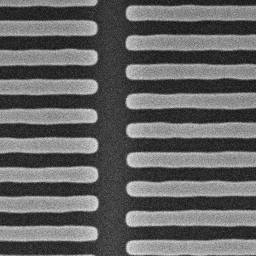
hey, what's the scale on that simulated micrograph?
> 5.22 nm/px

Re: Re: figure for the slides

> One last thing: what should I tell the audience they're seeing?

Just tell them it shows groups of lines, slits or small figures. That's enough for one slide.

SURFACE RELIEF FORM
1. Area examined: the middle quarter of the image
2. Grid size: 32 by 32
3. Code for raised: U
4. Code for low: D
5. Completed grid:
DDDDDDDDDDDDDDDDUUUUUUUUUUUUUUUU
DDDDDDDDDDDDDDDDUUUUUUUUUUUUUUUU
DDDDDDDDDDDDDDDDUUUUUUUUUUUUUUUU
DDDDDDDDDDDDDDDDUUUUUUUUUUUUUUUU
UUUUUUUUDDDDDDDDDDDDDDDDDDDDDDDD
UUUUUUUUDDDDDDDDDDDDDDDDDDDDDDDD
UUUUUUUUDDDDDDDDDDDDDDDDDDDDDDDD
DDDDDDDDDDDDDDDDDDDDDDDDDDDDDDDD
DDDDDDDDDDDDDDDDUUUUUUUUUUUUUUUU
DDDDDDDDDDDDDDDDUUUUUUUUUUUUUUUU
DDDDDDDDDDDDDDDDUUUUUUUUUUUUUUUU
UUUUUUUDDDDDDDDDDDDDDDDDDDDDDDDD
UUUUUUUUDDDDDDDDDDDDDDDDDDDDDDDD
UUUUUUUUDDDDDDDDDDDDDDDDDDDDDDDD
UUUUUUUUDDDDDDDDDDDDDDDDDDDDDDDD
DDDDDDDDDDDDDDDDUUUUUUUUUUUUUUUU
DDDDDDDDDDDDDDDDUUUUUUUUUUUUUUUU
DDDDDDDDDDDDDDDDUUUUUUUUUUUUUUUU
DDDDDDDDDDDDDDDDDDDDDDDDDDDDDDDD
UUUUUUUUDDDDDDDDDDDDDDDDDDDDDDDD
UUUUUUUUDDDDDDDDDDDDDDDDDDDDDDDD
UUUUUUUUDDDDDDDDDDDDDDDDDDDDDDDD
DDDDDDDDDDDDDDDDUUUUUUUUUUUUUUUU
DDDDDDDDDDDDDDDDUUUUUUUUUUUUUUUU
DDDDDDDDDDDDDDDDUUUUUUUUUUUUUUUU
DDDDDDDDDDDDDDDDUUUUUUUUUUUUUUUU
UUUUUUUUDDDDDDDDDDDDDDDDDDDDDDDD
UUUUUUUUDDDDDDDDDDDDDDDDDDDDDDDD
UUUUUUUUDDDDDDDDDDDDDDDDDDDDDDDD
DDDUUUUDDDDDDDDDDDUUDDDDDDUUUUUU
DDDDDDDDDDDDDDDDUUUUUUUUUUUUUUUU
DDDDDDDDDDDDDDDDUUUUUUUUUUUUUUUU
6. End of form